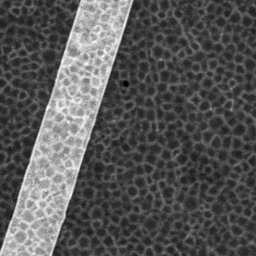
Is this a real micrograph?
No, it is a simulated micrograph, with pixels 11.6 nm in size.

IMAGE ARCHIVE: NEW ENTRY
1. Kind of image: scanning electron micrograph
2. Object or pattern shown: one or a few lines or trenches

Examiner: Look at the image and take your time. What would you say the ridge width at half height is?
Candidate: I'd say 561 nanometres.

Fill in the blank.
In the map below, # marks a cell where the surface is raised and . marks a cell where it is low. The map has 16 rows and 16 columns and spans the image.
.....###........
.....###........
....###.........
....###.........
....###.........
...####.........
...###..........
...###..........
..####..........
..###...........
..###...........
.####...........
.###............
.###............
####............
###.............